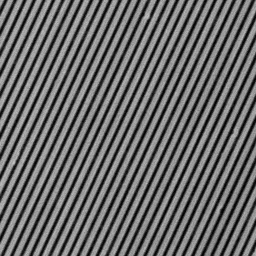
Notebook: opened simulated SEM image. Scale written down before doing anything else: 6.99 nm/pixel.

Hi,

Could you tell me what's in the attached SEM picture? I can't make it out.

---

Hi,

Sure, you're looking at parallel lines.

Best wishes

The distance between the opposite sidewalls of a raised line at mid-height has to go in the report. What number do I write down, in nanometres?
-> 29.3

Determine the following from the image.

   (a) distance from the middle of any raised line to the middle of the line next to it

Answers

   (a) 60.5 nanometres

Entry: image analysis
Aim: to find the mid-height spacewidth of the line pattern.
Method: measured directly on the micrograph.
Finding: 29.3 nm